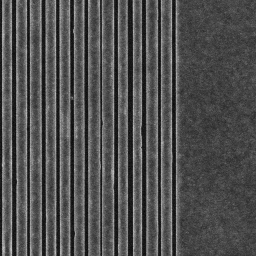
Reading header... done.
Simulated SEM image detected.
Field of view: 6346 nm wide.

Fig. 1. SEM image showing parallel lines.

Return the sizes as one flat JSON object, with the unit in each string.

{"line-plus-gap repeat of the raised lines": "360 nm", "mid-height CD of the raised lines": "10.3 pixels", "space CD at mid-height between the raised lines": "0.0992 microns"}